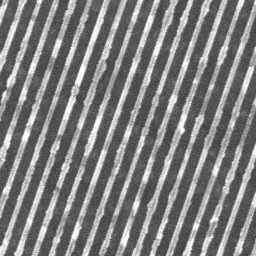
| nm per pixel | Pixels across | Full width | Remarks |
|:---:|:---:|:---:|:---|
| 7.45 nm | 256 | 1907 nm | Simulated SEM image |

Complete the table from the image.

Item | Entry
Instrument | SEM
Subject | parallel lines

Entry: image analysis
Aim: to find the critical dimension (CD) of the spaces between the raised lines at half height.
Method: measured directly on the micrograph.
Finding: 11.4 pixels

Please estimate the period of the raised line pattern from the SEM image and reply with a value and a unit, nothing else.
118 nanometres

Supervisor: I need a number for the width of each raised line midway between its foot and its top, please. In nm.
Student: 35.1